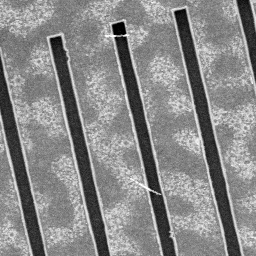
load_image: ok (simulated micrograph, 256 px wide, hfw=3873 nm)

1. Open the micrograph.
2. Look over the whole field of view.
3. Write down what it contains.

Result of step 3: parallel lines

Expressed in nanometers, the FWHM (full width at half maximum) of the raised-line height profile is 751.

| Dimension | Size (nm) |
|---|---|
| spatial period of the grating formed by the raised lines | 965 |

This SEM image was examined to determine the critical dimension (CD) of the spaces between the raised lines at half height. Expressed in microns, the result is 0.209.